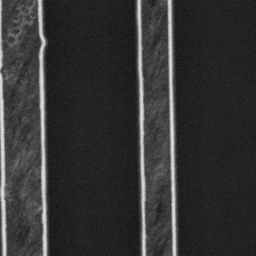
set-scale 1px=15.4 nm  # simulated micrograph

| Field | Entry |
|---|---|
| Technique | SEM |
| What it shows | one or a few lines or trenches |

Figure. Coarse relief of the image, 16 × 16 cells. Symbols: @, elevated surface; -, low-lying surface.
@@@------@@-----
@@@------@@-----
@@@------@@-----
@@@------@@-----
@@@------@@-----
@@@------@@-----
@@@------@@-----
@@@------@@-----
@@@------@@-----
@@@------@@-----
@@@------@@-----
@@@------@@-----
@@@------@@-----
@@@------@@-----
@@@------@@-----
@@@------@@-----